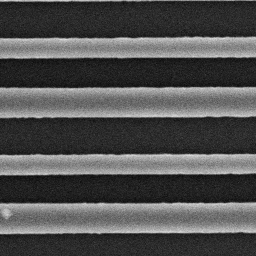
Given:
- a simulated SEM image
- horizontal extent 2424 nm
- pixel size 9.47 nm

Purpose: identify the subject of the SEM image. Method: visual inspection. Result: lines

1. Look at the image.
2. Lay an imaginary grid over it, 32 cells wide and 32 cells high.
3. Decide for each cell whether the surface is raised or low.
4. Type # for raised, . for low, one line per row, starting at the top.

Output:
................................
................................
................................
................................
................................
################################
################################
................................
................................
................................
................................
################################
################################
################################
##########################.#..#.
................................
................................
................................
................................
################################
################################
################################
................................
................................
................................
..........#.#.#.#...############
################################
################################
################################
................................
................................
................................